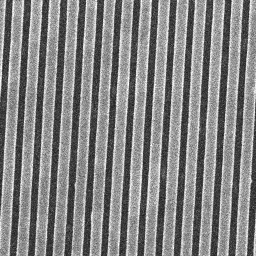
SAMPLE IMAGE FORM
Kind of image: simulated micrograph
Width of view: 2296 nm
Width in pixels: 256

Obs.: parallel lines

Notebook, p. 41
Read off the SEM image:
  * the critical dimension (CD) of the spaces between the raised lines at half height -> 69.4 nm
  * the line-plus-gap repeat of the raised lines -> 163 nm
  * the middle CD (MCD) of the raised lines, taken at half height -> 10.2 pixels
